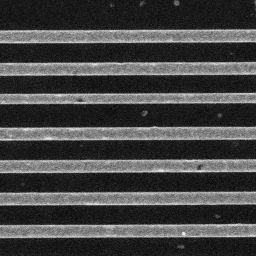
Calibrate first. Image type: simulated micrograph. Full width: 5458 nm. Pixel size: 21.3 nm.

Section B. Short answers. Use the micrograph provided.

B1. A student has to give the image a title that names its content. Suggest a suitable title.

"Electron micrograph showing parallel lines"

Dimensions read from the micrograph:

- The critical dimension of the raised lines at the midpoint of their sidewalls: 258 nm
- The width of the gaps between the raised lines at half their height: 434 nanometres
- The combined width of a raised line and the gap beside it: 32.4 pixels